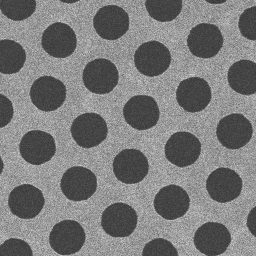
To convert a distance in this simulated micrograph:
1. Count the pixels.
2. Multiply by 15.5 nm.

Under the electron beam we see a regular array of holes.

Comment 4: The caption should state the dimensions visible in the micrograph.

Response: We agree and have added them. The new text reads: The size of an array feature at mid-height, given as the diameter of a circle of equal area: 0.561 micrometres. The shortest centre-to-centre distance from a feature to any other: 844 nm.